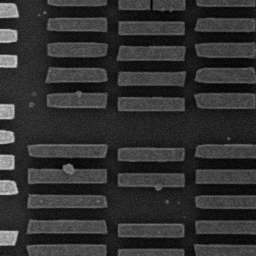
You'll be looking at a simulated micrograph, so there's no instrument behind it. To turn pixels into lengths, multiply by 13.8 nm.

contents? wiring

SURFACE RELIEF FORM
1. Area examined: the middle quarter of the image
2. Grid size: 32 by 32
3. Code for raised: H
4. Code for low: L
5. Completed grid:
LLLLLLLLLLLLLLLLLLLLLLLLLLLLLLLL
HHHHHHHHHHLLLLLLLLLLLLLLLLLLLLLL
HHHHHHHHHHLLLLHHHHHHHHHHHHHHHHLL
HHHHHHHHHHHLLLHHHHHHHHHHHHHHHHLL
LLLLLLLLLLLLLLHHHHHHHHHHHHHHHHLL
LLLLLLLLLLLLLLLLLLLLLLLLLLLLLLLL
LLLLLLLLLLLLLLLLLLLLLLLLLLLLLLLL
HHHHHHHHHHHLLLLLLLLLLLLLLLLLLLLL
HHHHHHHHHHHLLLLLLLLLLLLLLLLLLLLL
HHHHHHHHHHLLLLHHHHHHHHHHHHHHHHLL
HHHHHHHHHHLLLLHHHHHHHHHHHHHHHHLL
LLLLLLLLLLLLLLHHHHHHHHHHHHHHHHLL
LLLLLLLLLLLLLLLLLLLLLLLLLLLLLLLL
LLLLLLLLLLLLLLLLLLLLLLLLLLLLLLLL
LLLLLLLLLLLLLLLLLLLLLLLLLLLLLLLL
LLLLLLLLLLLLLLLLLLLLLLLLLLLLLLLL
LLLLLLLLLLLLLLLLLLLLLLLLLLLLLLLL
LLLLLLLLLLLLLLLLLLLLLLLLLLLLLLLL
LLLLLLLLLLLLLLLLLLLLLLLLLLLLLLLL
LLLLLLLLLLLLLLLLLLLLLLLLLLLLLLLL
HHHHHHHHHHHLLLLLLLLLLLLLLLLLLLLL
HHHHHHHHHHHLLLHHHHHHHHHHHHHHHHLL
HHHHHHHHHHLLLLHHHHHHHHHHHHHHHHLL
LLLLLLLLLLLLLLHHHHHHHHHHHHHHHHLL
LLLLLLLLLLLLLLLLLLLLLLLLLLLLLLLL
HHLLLLLLLLLLLLLLLLLLLLLLLLLLLLLL
HHHLLLLLLLLLLLLLLLLLLLLLLLLLLLLL
HHHHHHHHHHLLLLHHHHHHHHHHHHHHHHLL
HHHHHHHHHHLLLLHHHHHHHHHHHHHHHHLL
HHHHHHHHHHLLLLHHHHHHHHHHHHHHHHLL
LLLLLLLLLLLLLLHHHHHHHHHHHHHHHHLL
LLLLLLLLLLLLLLLLLLLLLLLLLLLLLLLL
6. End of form